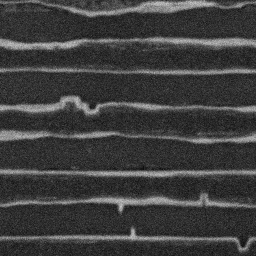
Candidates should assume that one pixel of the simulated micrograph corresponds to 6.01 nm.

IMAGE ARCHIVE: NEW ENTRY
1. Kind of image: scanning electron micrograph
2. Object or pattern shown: one or a few lines or trenches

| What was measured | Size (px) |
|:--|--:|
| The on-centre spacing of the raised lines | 65.5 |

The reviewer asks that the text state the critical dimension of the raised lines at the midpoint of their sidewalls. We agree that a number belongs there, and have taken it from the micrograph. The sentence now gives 0.19 micrometres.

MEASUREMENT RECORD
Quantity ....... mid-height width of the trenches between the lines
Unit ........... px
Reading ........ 34.2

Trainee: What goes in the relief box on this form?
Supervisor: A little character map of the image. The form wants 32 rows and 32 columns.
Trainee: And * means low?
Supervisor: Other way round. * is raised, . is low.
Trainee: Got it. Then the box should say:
.....**************************.
..........******................
................................
................................
................................
***.****************************
********************************
********************************
********************************
................................
................................
................................
........**......................
*......****.***************.....
********************************
********************************
********************************
.......................****..**.
................................
................................
................................
*...............................
********************************
********************************
********************************
**...**........*..........******
................................
................................
................................
................*...............
******************************.*
********************************